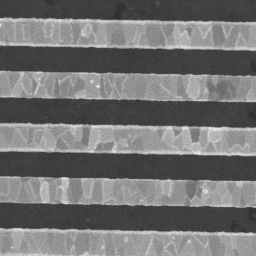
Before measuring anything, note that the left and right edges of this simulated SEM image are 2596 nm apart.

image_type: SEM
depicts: lines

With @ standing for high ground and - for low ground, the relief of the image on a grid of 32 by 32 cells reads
--------------------------------
--------------------------------
@@@@@@@@@@@@@-------------------
@@@@@@@@@@@@@@@@@@@@@@@@@@@@@@@@
@@@@@@@@@@@@@@@@@@@@@@@@@@@@@@@@
@@@@@@@@@@@@@@@@@@@@@@@@@@@@@@@@
--------------------------------
--------------------------------
--------------------------------
@@@@@@@@@@@@@@@@@@@@@@@@@@@@@@@@
@@@@@@@@@@@@@@@@@@@@@@@@@@@@@@@@
@@@@@@@@@@@@@@@@@@@@@@@@@@@@@@@@
------------------@@@@@@@@@@@@@@
--------------------------------
--------------------------------
@@@@--@@------------------------
@@@@@@@@@@@@@@@@@@@@@@@@@@@@@@@@
@@@@@@@@@@@@@@@@@@@@@@@@@@@@@@@@
@@@@@@@@@@@@@@@@@@@@@@@@@@@@@@@@
--------------------------------
--------------------------------
--------------------------------
@@@@@@@@@@@@@@@@@@@@-@----------
@@@@@@@@@@@@@@@@@@@@@@@@@@@@@@@@
@@@@@@@@@@@@@@@@@@@@@@@@@@@@@@@@
----------@--@@@@@@@@@@@@@@@@@@@
--------------------------------
--------------------------------
--------------------------------
@@@@@@@@@@@@@@@@@@@@@@@@@@@@@@@@
@@@@@@@@@@@@@@@@@@@@@@@@@@@@@@@@
@@@@@@@@@@@@@@@@@@@@@@@@@@@@@@@@